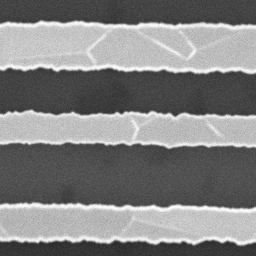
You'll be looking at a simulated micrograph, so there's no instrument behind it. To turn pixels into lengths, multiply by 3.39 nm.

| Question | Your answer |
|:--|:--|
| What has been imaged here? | lines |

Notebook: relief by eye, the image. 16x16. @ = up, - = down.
----------------
@@@@@@@--@--@@--
@@@@@@@@@@@@@@@@
@@@@@@@@@@@@@@@@
------------@--@
----------------
----------------
@@@@@@@@@@@@@@@@
@@@@@@@@@@@@@@@@
----------------
----------------
----------------
----------------
@@@@@@@@@@@@@@@@
@@@@@@@@@@@@@@@@
----------------